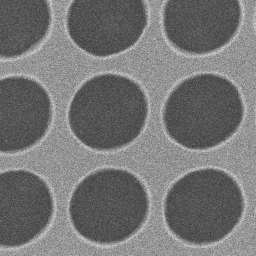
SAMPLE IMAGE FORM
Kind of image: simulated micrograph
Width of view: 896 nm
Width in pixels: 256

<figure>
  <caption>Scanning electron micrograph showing holes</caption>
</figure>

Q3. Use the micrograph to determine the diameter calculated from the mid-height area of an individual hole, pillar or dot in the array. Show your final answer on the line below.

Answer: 272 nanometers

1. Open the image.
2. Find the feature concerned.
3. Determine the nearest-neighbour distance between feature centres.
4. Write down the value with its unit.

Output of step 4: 330 nm